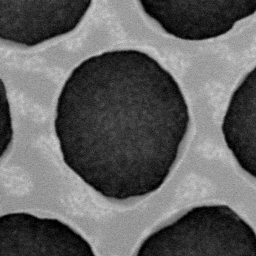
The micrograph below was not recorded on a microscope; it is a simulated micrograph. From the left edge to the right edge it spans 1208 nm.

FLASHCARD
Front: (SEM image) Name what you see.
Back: holes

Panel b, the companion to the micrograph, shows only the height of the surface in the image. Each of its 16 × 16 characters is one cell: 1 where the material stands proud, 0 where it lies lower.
0000001110000000
0000011111000001
0001111111111111
1111110001111111
1111100000111111
1111000000011110
0111000000001100
0110000000001100
0111000000001100
0111000000011100
1111000000011110
1111100000111111
1111111001111111
0011111111100001
0000011111000000
0000001110000000